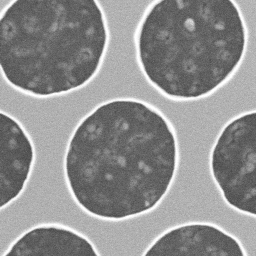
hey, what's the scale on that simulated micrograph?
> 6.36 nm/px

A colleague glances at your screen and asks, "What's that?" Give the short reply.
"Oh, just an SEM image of holes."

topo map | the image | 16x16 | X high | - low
X-----XXXX-----X
------XXX------X
-------XX------X
------XXX------X
------XXX-----XX
X----XXXXX---XXX
XXXXXXX--XXXXXXX
-XXXX-----XXXXX-
--XXX------XXX--
--XX-------XX---
--XX-------XX---
-XXX-------XXX--
-XXXX-----XXXX--
XXXXXX--XXXXXXXX
XX--XXXXXXX---XX
X-----XXX------X